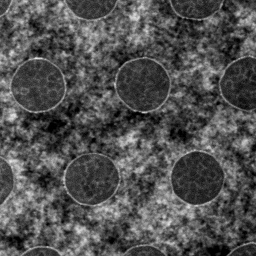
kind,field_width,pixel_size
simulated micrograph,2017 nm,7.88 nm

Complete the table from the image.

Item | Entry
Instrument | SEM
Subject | raised bodies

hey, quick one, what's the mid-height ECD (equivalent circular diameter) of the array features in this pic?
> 427 nm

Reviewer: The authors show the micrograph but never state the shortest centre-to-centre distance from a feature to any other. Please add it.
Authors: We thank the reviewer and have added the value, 828 nanometers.